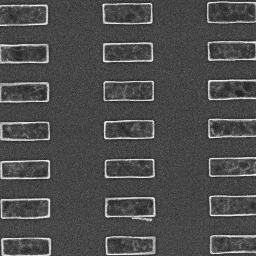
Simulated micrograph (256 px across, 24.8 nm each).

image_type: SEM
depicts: wiring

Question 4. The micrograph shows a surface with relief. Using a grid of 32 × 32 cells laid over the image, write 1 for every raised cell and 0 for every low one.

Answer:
00000000000000000000000000111111
11111100000001111110000000111111
11111100000001111110000000111111
00000000000000000000000000000000
00000000000000000000000000000000
00000000000000001110000000111111
11111100000001111110000000111111
11111100000001111110000000000000
00000000000000000000000000000000
00000000000000000000000000000000
00011100000001111110000000111111
11111100000001111110000000111111
11111100000001000100000000000000
00000000000000000000000000000000
00000000000000000000000000000000
01111100000001111110000000111111
11111100000001111110000000111111
00000000000000000000000000000000
00000000000000000000000000000000
00000000000000000000000000000000
11111100000001111110000000111111
11111100000001111110000000111111
00000000000000000000000000000000
00000000000000000000000000000000
00000000000000000000000000000000
11111100000001111110000000111111
11111100000001111110000000111111
00000000000000000000000000000000
00000000000000000000000000000000
00000000000000000000000000000000
11111100000001111110000000111111
11111100000001111110000000011000